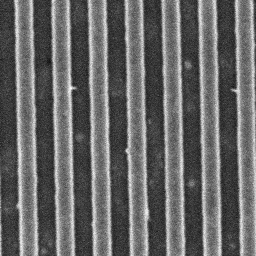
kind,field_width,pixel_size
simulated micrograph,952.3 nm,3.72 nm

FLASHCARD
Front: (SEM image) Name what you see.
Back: parallel lines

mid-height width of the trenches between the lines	74.8	nanometres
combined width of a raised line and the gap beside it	136	nanometres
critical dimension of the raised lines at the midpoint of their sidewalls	60.4	nanometers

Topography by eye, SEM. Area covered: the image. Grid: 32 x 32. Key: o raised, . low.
..oo...oo..oo...oo..oo...oo...o.
..oo...oo..oo...oo..oo...oo...oo
..oo...oo..oo...oo..oo...oo...oo
..oo...oo..oo...oo..oo...oo...oo
..oo...oo..oo...oo..oo...oo...oo
..oo...oo..oo...oo..oo...oo...oo
..oo...oo..oo...oo..oo...oo...oo
..oo...oo..oo...oo...o...oo...oo
..oo...oo..oo...oo...o...oo...oo
..oo...oo..oo...oo...o...oo...oo
..oo...oo..oo...oo...oo..oo...oo
..oo...oo..oo...oo...oo..oo...oo
..oo...oo..oo...oo...oo..oo...oo
..oo...oo..oo...oo...oo..oo...oo
..oo...oo..oo...oo...oo..oo...oo
..oo...oo..oo...oo...oo..oo...oo
..oo...oo...o...oo...oo..oo...oo
..oo...oo...o...oo...oo..oo...oo
..oo...oo...oo..oo...oo..oo...oo
..oo...oo...oo..oo...oo..oo...oo
..oo...oo...oo..oo...oo..oo...oo
..oo...oo...oo..oo...oo..oo...oo
..oo...oo...oo..oo...oo..oo...oo
..oo...oo...oo..oo...oo..oo...oo
..oo...oo...oo..oo...oo..oo...oo
..ooo..oo...oo..oo...oo..oo...oo
...o...oo...oo..oo...oo..oo...oo
...oo..oo...oo..oo...oo...o...oo
...oo..oo...oo..oo...oo..ooo..oo
...oo..oo...oo..oo...oo...oo..oo
...oo..oo...oo..oo...oo...oo..oo
...oo..oo...oo..oo...oo...o...oo